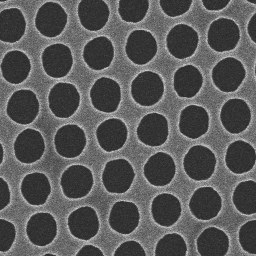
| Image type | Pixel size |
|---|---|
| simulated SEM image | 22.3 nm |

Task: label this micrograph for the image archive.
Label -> a regular array of holes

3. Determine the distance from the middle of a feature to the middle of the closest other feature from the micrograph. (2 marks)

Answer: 900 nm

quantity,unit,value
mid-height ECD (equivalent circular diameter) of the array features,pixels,33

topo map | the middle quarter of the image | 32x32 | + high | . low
..++++.....+++++++++++++++++++..
..+++++..+++++++++++++++++++....
.++++++++++++++++++....+++++....
+++++++++..+++++++......+++.....
++++++++.....++++........++.....
...++++.......+++........++.....
...++++.......+++........+++....
....++........+++........+++....
....+++.......+++.......++++++++
....+++.......++++.....+++++++++
....+++......++++++++++++++++++.
...++++++....+++++++++++++++++..
..+++++++++++++++++++...+++++...
.+++++++++++++++++++.....++++...
++++++++++....+++++.......+++...
...++++++......++++.......+++...
.....+++........++........+++...
.....+++........++........++++..
.....+++........+++.......+++++.
......+++......++++......+++++++
.....++++......+++++++..++++++++
.....+++++...++++++++++++++++++.
....+++++++++++++++++++...+++++.
+..++++++++++++++++++......+++..
+++++++++++.....+++++.......++..
++...+++++.......+++........++..
+......+++.......+++........++..
.......+++........++........+++.
.......++........+++.......+++++
.......+++.......++++......+++++
.......+++.......+++++++.+++++++
......+++++.....++++++++++++++++